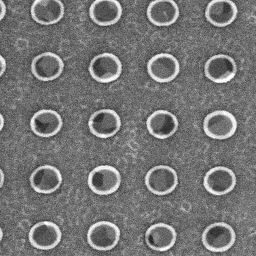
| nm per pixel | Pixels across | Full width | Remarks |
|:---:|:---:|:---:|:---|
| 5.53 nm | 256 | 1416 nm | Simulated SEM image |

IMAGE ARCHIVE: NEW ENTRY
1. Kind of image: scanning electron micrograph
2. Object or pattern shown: a regular array of raised bodies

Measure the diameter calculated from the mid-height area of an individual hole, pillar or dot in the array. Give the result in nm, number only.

149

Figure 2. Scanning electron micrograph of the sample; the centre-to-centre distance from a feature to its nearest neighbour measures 310 nm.